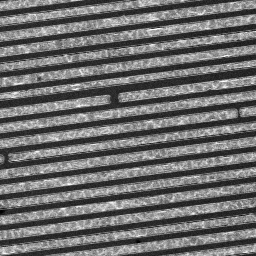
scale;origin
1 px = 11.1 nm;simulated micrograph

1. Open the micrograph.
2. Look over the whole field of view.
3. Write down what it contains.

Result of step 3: parallel lines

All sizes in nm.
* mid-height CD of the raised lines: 71.5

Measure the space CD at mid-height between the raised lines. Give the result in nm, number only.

98.9